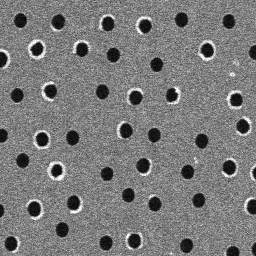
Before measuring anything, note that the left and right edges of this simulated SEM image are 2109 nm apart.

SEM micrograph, a regular array of holes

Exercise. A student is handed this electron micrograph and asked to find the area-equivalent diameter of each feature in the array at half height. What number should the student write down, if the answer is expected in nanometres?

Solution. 115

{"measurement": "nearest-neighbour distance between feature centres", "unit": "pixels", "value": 32.2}